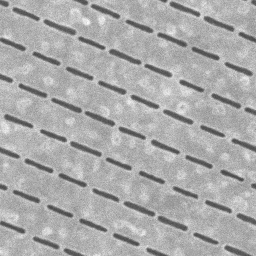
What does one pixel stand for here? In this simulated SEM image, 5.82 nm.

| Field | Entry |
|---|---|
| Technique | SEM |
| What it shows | a regular array of holes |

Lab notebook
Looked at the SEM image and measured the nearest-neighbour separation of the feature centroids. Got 0.195 µm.